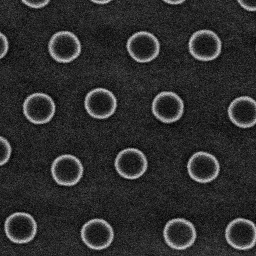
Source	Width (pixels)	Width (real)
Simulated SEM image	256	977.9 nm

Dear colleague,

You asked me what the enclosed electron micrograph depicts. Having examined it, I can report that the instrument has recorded a regular array of raised bodies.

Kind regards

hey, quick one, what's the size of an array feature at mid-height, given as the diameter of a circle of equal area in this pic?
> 29.8 px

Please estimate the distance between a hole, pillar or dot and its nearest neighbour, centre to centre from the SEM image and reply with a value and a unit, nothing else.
246 nm